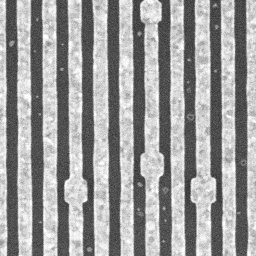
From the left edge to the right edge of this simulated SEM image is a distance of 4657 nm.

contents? wiring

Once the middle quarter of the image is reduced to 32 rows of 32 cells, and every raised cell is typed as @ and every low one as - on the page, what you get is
-@@@----@@@---@@@---@@@----@@@--
-@@@----@@@---@@@---@@@----@@@--
-@@@----@@@---@@@---@@@@---@@@--
-@@@----@@@---@@@---@@@@---@@@--
-@@@----@@@---@@@---@@@@---@@@--
-@@@----@@@---@@@---@@@@---@@@--
-@@@----@@@---@@@---@@@@---@@@--
-@@@----@@@---@@@---@@@@---@@@--
-@@@----@@@---@@@----@@@---@@@--
-@@@----@@@---@@@----@@@---@@@--
-@@@----@@@---@@@----@@@---@@@--
-@@@----@@@---@@@----@@@---@@@--
-@@@----@@@---@@@---@@@@---@@@--
-@@@----@@@---@@@---@@@@---@@@--
-@@@----@@@---@@@---@@@@---@@@--
-@@@----@@@---@@@---@@@@---@@@--
-@@@----@@@---@@@---@@@@---@@@--
-@@@----@@@---@@@---@@@@---@@@--
-@@@----@@@---@@@---@@@@---@@@--
-@@@----@@@---@@@---@@@@---@@@--
-@@@----@@@---@@@---@@@@---@@@--
--@@----@@@---@@@---@@@@---@@@--
--@@----@@@---@@@---@@@@---@@@--
--@@----@@@---@@@--@@@@@@--@@@--
--@@----@@@---@@@--@@@@@@--@@@--
--@@----@@@---@@@--@@@@@@--@@@--
--@@----@@@---@@@--@@@@@@--@@@--
--@@----@@@----@@--@@@@@@--@@@--
-@@@@---@@@----@@---@@@@---@@@--
@@@@@@--@@@----@@----@@@---@@@--
@@@@@@--@@@----@@----@@@---@@@--
@@@@@@--@@@----@@----@@----@@@--